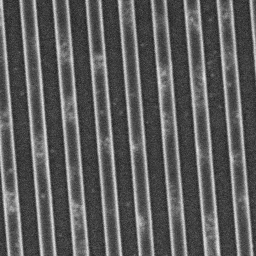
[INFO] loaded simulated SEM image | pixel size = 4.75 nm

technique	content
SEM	parallel lines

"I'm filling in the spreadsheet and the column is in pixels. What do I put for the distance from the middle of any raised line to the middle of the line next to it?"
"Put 32.7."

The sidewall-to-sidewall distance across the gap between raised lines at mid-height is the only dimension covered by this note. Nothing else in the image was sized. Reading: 0.0851 microns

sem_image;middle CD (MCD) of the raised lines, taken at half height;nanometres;69.2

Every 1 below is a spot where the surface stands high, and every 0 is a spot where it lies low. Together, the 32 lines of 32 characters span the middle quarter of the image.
11000001110000011110000111100001
11000001111000011110000111100000
11000001111000011110000111100000
11000001111000011110000011100000
11000001111000011110000011100000
11000001111000001110000011100000
11100001111000001110000011100000
11100000111000001110000011100000
11100000111000001110000011100000
11100000111000001110000011110000
11100000111000001110000011110000
11100000111000001111000011110000
11100000111000001111000011110000
11100000111100001111000011110000
11100000111100001111000011110000
11100000111100001111000001110000
11100000111100001111000001110000
11100000111100000111000001110000
11110000111100001111000001110000
11110000011100000111000001110000
11110000011100000111000001110000
01110000011100000111000001110000
01110000011100000111000001111000
01110000011100000111000001111000
01110000011100000111100001111000
01110000011100000111100001111000
01110000011110000111100001111000
01110000011110000111100000111000
01110000011110000111100000111000
01110000011110000011100000111000
01111000011110000011100000111000
01111000001110000011100000111000